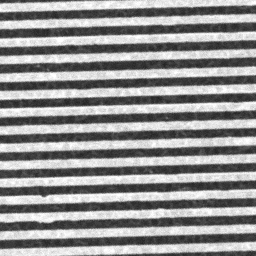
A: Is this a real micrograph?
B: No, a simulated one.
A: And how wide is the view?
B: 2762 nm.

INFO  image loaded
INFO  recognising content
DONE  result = parallel lines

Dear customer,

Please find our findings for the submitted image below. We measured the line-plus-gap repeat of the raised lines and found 189 nanometers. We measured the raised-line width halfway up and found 6.87 px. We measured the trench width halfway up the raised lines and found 115 nanometers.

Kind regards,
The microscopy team